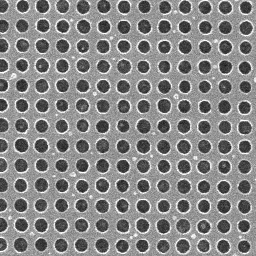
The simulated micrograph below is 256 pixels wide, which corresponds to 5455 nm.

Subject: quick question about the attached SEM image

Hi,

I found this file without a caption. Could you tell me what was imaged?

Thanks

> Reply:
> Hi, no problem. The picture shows a regular array of holes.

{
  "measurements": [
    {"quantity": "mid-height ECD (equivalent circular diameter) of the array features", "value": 284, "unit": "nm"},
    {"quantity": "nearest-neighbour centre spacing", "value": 419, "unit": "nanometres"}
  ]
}